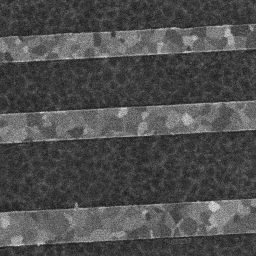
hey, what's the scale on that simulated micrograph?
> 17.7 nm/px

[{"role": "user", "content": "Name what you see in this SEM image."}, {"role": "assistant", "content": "one or a few lines or trenches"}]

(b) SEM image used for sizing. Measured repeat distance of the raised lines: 89.6 pixels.